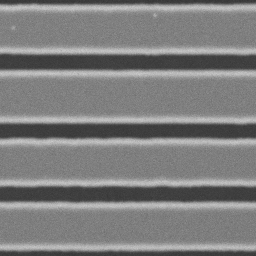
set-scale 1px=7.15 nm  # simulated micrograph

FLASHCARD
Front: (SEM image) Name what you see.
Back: lines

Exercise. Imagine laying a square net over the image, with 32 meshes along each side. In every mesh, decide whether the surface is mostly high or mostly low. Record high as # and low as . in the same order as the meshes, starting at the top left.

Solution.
................................
################################
################################
################################
################################
################################
################################
................................
................................
################################
################################
################################
################################
################################
################################
................................
................................
################################
################################
################################
################################
################################
################################
................................
................................
################################
################################
################################
################################
################################
################################
................................